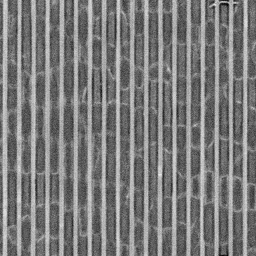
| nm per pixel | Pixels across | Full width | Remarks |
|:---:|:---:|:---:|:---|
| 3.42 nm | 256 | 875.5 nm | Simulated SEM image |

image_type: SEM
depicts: parallel lines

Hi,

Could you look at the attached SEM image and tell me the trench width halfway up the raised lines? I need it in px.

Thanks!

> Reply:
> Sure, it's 10.5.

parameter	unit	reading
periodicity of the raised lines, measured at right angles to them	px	14.1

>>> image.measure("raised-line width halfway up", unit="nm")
12